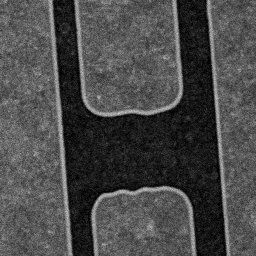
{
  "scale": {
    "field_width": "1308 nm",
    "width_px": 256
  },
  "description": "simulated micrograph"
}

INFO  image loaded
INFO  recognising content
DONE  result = one or a few lines or trenches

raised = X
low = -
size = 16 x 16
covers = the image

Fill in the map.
XXX--XXXXXX--XXX
XXX--XXXXXX--XXX
XXX--XXXXXX--XXX
XXX--XXXXXX--XXX
XXXX-XXXXXX--XXX
XXXX-XXXXXX--XXX
XXXX-XXXXXX---XX
XXXX----------XX
XXXX----------XX
XXXX----------XX
XXXX----------XX
XXXX----------XX
XXXX--XXXXXX--XX
XXXX--XXXXXX--XX
XXXX--XXXXXX--XX
XXXX--XXXXXX--XX